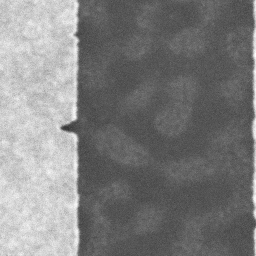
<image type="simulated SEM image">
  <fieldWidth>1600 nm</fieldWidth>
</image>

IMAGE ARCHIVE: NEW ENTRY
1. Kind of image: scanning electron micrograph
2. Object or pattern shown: one or a few lines or trenches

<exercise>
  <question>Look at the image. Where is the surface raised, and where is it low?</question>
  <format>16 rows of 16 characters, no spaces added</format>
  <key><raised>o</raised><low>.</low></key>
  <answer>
ooooo...........
ooooo...........
ooooo...........
ooooo...........
ooooo...........
ooooo...........
ooooo...........
oooo............
oooo............
ooooo...........
ooooo...........
ooooo...........
ooooo...........
ooooo...........
ooooo...........
ooooo...........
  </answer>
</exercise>